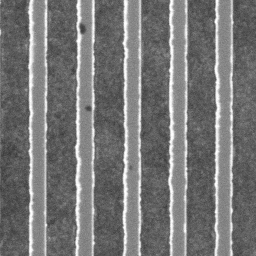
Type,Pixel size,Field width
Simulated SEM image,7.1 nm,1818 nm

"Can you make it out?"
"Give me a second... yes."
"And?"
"lines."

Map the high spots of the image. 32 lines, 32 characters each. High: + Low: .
....++....++....++...++....++...
....++....++....++...++....++...
....++....++....++...++....++...
....++....++....++...++....++...
....++....++....++...++....++...
....++....++....++...++....++...
....++....++....++...++....++...
....++....++....++...++....++...
....++....++....++...++....++...
....++....++....++...++....++...
....++....++....++...++....++...
....++....++....++...++....++...
....++....++....++...++....++...
....++....++....++...++....++...
....++....++....++...++....++...
....++....++....++...++....++...
....++....++....++...++....++...
....++....++....++...++....++...
....++....++....++...++....++...
....++....++....++...++....++...
....++....++....++...++....++...
....++....++....++...++....++...
....++....++...+++...++....++...
....++....++....++...++....++...
....++....++....++...++....++...
....++....++....++...++....++...
....++....++...+++...++....++...
....++....++...+++...++....++...
....++....++...+++...++....++...
....++....++....++...++....++...
....++....++....++...++....++...
....++....++...+++...++....++...